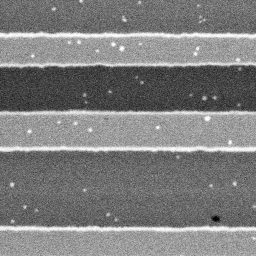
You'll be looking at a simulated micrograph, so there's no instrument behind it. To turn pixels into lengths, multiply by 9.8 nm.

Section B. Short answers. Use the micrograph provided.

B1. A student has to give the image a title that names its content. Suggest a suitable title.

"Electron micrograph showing lines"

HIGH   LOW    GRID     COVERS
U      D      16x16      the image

DDDDDDDDDDDDDDDD
DDDDDDDDDDDDDDDD
UUUUUUUUUUUUUUUU
UUUUUUUUUUUUUUUU
DDDDDDDDDDDDDDDD
DDDDDDDDDDDDDDDD
DDDDDDDDDDDDDDDD
UUUUUUUUUUUUUUUU
UUUUUUUUUUUUUUUU
DDDDDDDDDDDDDDDD
DDDDDDDDDDDDDDDD
DDDDDDDDDDDDDDDD
DDDDDDDDDDDDDDDD
DDDDDDDDDDDDDDDD
UUUUUUUUUUUUUUUU
UUUUUUUUUUUUUUUU